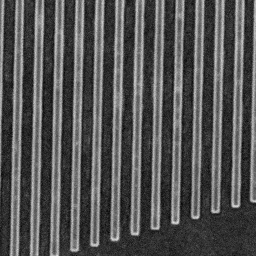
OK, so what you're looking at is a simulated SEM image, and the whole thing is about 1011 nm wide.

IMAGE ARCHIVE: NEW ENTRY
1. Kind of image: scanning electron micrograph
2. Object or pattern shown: parallel lines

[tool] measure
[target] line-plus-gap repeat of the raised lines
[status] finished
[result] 79 nm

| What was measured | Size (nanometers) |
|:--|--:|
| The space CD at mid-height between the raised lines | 52.3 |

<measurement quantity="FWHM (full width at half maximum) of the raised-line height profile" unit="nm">28.1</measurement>